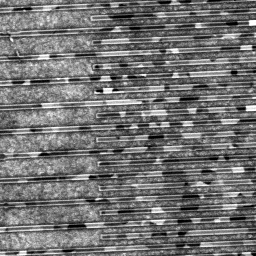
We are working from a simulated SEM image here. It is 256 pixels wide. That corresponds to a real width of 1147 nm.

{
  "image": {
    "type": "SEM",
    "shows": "parallel lines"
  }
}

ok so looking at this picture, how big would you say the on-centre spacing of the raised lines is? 54.5 nm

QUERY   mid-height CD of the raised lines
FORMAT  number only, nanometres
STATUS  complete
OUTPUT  19.6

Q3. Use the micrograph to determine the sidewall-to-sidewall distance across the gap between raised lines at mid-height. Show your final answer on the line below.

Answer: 35.8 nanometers